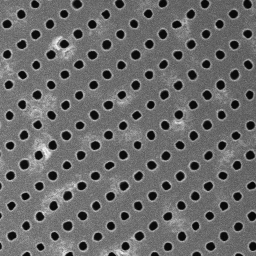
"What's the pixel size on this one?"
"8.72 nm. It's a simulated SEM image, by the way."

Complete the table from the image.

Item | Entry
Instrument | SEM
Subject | a regular array of holes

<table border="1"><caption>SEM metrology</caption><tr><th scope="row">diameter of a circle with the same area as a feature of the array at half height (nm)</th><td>74.3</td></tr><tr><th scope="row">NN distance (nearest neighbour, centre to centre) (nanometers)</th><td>148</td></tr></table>